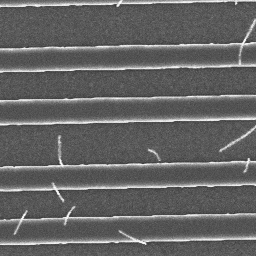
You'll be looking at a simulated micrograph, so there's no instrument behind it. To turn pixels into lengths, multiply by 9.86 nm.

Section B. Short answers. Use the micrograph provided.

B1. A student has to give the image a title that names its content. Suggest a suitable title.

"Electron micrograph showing lines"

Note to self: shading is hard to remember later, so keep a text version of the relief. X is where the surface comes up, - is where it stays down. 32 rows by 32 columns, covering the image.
XXXXXXXXXXXXXXX-----------------
--------------------------------
--------------------------------
--------------------------------
--------------------------------
--------------------------X-XXXX
XXXXXXXXXXXXXXXXXXXXXXXXXXXXXXXX
XXXXXXXXXXXXXXXXXXXXXXXXXXXXXXXX
XXXXXXXXXXXXXXXXXXXX------------
--------------------------------
--------------------------------
--------------------------------
--XXXXXXXXXXXXXXXXXXXXXXXXXXXXXX
XXXXXXXXXXXXXXXXXXXXXXXXXXXXXXXX
XXXXXXXXXXXXXXXXXXXXXXXXXXXXXXXX
X-------------------------------
--------------------------------
--------------------------------
--------------------------------
--------------------------------
--------------------XXXXXXXXXXXX
XXXXXXXXXXXXXXXXXXXXXXXXXXXXXXXX
XXXXXXXXXXXXXXXXXXXXXXXXXXXXXXXX
XXXXXXXXXXXXXXXX----------------
--------------------------------
--------------------------------
--------------------------------
-XXXXXXXXXXXXXXXXXXXXXXXXXXXXXXX
XXXXXXXXXXXXXXXXXXXXXXXXXXXXXXXX
XXXXXXXXXXXXXXXXXXXXXXXXXXXXXXXX
XXXXX---------------------------
--------------------------------